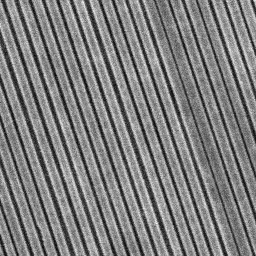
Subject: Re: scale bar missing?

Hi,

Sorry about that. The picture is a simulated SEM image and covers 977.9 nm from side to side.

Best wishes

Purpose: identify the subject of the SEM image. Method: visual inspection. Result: parallel lines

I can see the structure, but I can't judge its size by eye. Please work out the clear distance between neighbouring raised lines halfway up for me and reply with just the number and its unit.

0.0185 micrometres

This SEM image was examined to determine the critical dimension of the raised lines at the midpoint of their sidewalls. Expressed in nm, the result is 33.5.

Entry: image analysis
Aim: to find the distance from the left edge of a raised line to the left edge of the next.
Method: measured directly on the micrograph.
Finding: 0.0502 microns